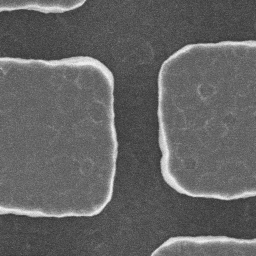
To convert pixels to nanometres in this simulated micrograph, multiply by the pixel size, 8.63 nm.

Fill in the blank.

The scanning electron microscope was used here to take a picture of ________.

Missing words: raised bodies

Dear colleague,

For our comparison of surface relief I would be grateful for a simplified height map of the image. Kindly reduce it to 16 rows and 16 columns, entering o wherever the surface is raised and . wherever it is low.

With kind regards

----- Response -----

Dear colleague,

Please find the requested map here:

oooo............
................
................
...........ooooo
ooooooo...oooooo
ooooooo...oooooo
ooooooo...oooooo
ooooooo...oooooo
ooooooo...oooooo
ooooooo...oooooo
ooooooo...oooooo
ooooooo....ooooo
ooooooo.........
...oo...........
................
..........oooooo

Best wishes